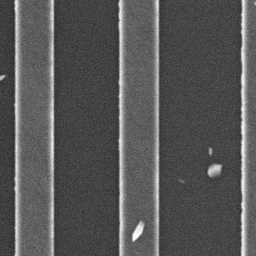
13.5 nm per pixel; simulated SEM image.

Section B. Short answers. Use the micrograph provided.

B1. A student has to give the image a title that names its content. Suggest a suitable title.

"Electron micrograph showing lines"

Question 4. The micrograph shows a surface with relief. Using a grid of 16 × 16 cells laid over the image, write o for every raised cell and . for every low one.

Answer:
.oo.....oo.....o
.oo.....oo.....o
.oo.....oo.....o
.oo.....oo.....o
.oo.....oo.....o
.oo.....oo.....o
.oo.....oo.....o
.oo.....oo.....o
.oo.....oo.....o
.oo.....oo.....o
.oo.....oo.....o
.oo.....oo.....o
.oo.....oo.....o
.oo.....oo.....o
.oo.....oo.....o
.oo.....oo.....o